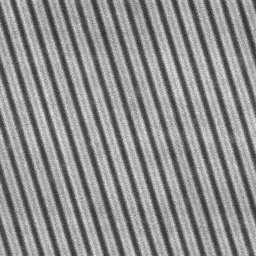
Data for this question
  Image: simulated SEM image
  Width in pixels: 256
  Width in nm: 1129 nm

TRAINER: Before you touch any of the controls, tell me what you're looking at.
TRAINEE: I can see parallel lines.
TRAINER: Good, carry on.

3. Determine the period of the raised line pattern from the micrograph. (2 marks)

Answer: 68.2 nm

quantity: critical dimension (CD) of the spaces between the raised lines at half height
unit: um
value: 0.0301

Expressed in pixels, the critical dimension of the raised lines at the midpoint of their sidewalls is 8.5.